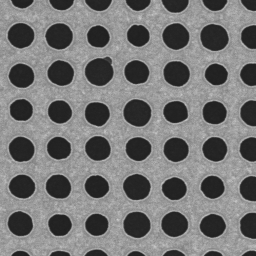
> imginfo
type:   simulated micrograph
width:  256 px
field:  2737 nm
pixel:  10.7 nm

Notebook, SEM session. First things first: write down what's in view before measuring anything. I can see a regular array of holes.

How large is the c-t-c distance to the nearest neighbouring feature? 394 nm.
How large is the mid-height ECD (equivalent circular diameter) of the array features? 266 nanometres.